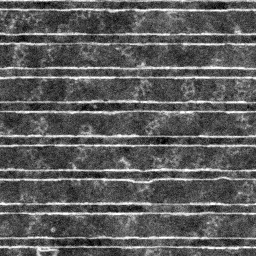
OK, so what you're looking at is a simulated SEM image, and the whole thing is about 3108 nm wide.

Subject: parallel lines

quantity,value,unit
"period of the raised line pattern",412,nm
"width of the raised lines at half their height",306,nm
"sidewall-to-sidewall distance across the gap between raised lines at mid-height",111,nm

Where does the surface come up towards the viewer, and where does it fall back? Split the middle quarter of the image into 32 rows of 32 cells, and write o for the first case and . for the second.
oooooooooooooooooooooooooooooooo
................................
................................
oooooooooooooo.oooo..ooooo...ooo
oooooooooooooooooooo.ooooooooooo
oooooooooooooooooooooooooooooooo
oooooooooooooooooooooooooooooooo
oooooooooooooooooooooooooooooooo
oooooooooooooooooooooooooooooooo
......oo..........ooooooooooooo.
................................
................................
oooooooooooooooooooooooooooooooo
oooooooooooooooooooooooooooooooo
oooooooooooooooooooooooooooooooo
oooooooooooooooooooooooooooooooo
oooooooooooooooooooooooooooooooo
oooooooooooooooooooooooooooooooo
................................
................................
oooooooooooooooooooooooooooooo.o
oooooooooooooooooooooooooooooooo
oooooooooooooooooooooooooooooooo
oooooooooooooooooooooooooooooooo
oooooooooooooo..oooooooooooooooo
oo.oooooooooooo.oooooooooooooooo
....ooooooooooooooooooooo.oooooo
................................
................................
oooooooooooooooooo...ooooooooooo
oooooooooooooooooooooooooooooooo
oooooooooooooooooooooooooooooooo